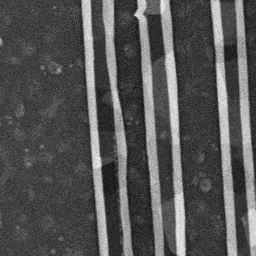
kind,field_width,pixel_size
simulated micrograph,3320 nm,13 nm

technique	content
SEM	one or a few lines or trenches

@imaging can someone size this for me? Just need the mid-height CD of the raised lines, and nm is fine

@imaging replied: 290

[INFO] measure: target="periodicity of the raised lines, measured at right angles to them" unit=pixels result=64.4